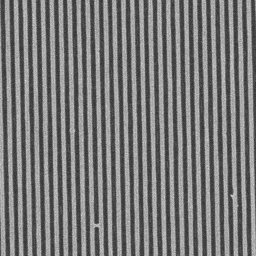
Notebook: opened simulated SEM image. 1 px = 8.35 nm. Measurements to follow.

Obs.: parallel lines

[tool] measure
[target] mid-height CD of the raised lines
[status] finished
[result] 35.5 nm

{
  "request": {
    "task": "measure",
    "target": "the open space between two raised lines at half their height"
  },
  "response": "42.8 nm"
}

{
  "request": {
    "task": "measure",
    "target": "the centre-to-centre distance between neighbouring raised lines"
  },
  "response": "0.0747 microns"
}